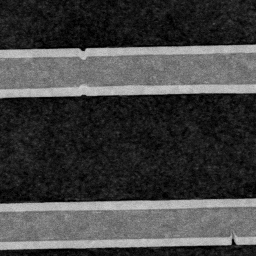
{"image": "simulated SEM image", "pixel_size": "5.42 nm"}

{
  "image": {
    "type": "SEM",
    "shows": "one or a few lines or trenches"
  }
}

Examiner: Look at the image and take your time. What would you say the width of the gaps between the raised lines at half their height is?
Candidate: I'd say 625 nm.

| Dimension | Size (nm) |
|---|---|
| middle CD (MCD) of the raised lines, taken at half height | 207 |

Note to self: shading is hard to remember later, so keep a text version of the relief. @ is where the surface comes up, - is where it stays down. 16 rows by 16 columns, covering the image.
----------------
----------------
----------------
@@@@@@@@@@@@@@@@
@@@@@@@@@@@@@@@@
@@@@@@@@@@@@@@@@
----------------
----------------
----------------
----------------
----------------
----------------
----------------
@@@@@@@@@@@@@@@@
@@@@@@@@@@@@@@@@
----------------